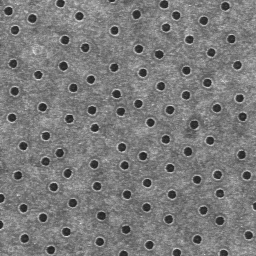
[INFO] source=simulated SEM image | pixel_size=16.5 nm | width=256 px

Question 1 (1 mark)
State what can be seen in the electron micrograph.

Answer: a regular array of holes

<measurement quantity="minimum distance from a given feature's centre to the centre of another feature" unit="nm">370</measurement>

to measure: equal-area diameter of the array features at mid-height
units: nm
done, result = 152